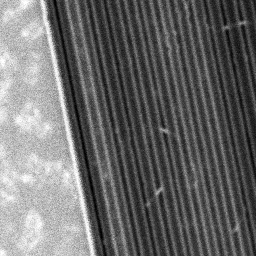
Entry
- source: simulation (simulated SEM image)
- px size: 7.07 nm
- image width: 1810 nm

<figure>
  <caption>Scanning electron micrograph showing parallel lines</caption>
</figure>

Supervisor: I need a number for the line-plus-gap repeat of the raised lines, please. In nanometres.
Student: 115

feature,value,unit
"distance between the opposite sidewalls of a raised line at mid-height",10.2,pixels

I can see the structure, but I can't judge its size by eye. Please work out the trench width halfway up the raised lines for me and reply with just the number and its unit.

39 nm